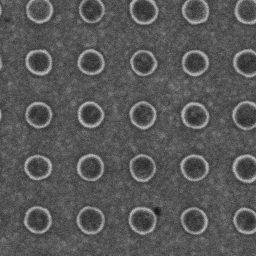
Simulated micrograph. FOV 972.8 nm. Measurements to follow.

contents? a regular array of raised bodies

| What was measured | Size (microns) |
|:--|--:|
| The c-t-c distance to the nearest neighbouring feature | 0.198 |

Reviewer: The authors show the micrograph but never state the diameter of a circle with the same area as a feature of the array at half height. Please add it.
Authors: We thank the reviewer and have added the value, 96.9 nanometers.